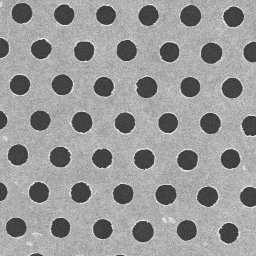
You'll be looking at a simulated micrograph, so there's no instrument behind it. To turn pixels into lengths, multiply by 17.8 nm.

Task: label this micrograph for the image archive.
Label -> a regular array of holes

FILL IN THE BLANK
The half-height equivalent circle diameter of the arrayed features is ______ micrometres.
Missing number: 0.366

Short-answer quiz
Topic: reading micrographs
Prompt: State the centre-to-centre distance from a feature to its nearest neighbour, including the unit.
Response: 41 px